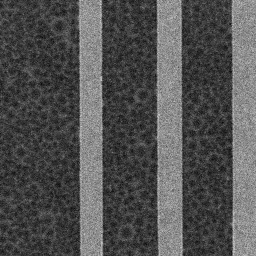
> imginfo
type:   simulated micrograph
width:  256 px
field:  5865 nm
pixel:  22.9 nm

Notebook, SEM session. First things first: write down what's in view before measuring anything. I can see one or a few lines or trenches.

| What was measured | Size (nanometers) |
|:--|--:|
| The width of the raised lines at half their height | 498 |